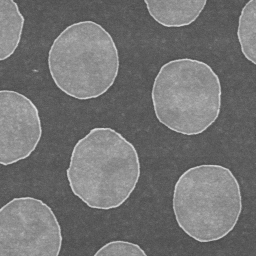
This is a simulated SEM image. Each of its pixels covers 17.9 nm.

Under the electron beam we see raised bodies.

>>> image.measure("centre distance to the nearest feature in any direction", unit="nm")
1930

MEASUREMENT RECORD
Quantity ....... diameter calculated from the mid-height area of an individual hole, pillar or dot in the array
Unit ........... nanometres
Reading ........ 1290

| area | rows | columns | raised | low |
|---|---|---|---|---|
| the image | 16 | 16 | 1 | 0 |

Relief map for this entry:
1000000001111001
1000010000110001
1000111000000001
0001111000000001
0001111000111000
0000111000111100
1100000000111100
1100000000111000
1100011000000000
1100011100000000
0000111110001100
0000111100011110
0100011100011110
1110000000011110
1111000000001100
1111001110000000